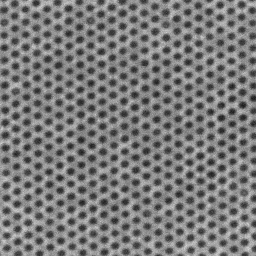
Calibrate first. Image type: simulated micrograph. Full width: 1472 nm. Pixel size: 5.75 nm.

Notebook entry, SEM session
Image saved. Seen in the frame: a regular array of holes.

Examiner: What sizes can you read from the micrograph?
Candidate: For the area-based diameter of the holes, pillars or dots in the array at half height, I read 46.3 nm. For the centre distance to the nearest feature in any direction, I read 0.0704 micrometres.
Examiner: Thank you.